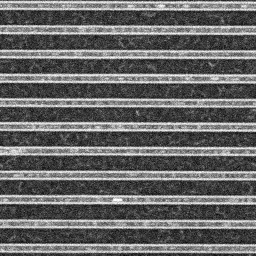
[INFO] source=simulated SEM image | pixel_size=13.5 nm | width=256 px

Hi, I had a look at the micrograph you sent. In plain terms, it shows parallel lines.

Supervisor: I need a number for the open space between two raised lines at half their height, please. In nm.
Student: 227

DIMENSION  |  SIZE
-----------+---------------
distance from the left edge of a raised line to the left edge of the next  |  327 nanometers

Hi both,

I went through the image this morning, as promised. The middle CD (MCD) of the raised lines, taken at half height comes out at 103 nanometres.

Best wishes